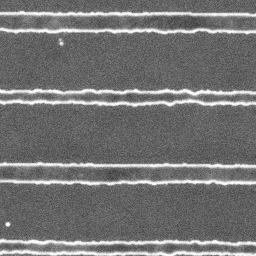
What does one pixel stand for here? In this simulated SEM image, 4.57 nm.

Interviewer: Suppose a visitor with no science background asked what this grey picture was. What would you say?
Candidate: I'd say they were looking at lines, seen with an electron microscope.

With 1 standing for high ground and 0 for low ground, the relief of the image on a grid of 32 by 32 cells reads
00000000000000000000000000000000
00000000000000000000000000000000
11111111111111111111111111111111
11111111111111111111111111111111
00000000000000000000000000000000
00000000000000000000000000000000
00000000000000000000000000000000
00000000000000000000000000000000
00000000000000000000000000000000
00000000000000000000000000000000
00000000000000000000000000000000
11111111111111111111111101110111
11111111111111111111111111111111
00000000000000000000000000000000
00000000000000000000000000000000
00000000000000000000000000000000
00000000000000000000000000000000
00000000000000000000000000000000
00000000000000000000000000000000
00000000000000000000000000000000
10001100000000000000000000000000
11111111111111111111111111111111
11111111111111111111111111111111
00000000000000000000000000000000
00000000000000000000000000000000
00000000000000000000000000000000
00000000000000000000000000000000
00000000000000000000000000000000
00000000000000000000000000000000
00000000000000000000000000000000
11111111111111111111111111111111
11111111111111111111111111111111